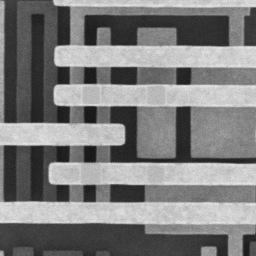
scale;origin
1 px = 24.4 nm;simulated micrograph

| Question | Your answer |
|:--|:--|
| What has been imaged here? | wiring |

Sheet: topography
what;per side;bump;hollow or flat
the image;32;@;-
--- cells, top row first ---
-------@@@@@@@@@@@@@@@@@@@@@@@@@
--------------------------------
--------------------------------
--------------------------------
--------------------------------
--------------------------------
-------@@@@@@@@@@@@@@@@@@@@@@@@@
-------@@@@@@@@@@@@@@@@@@@@@@@@@
--------------------------------
--------------------------------
--------------------------------
-------@@@@@@@@@@@@@@@@@@@@@@@@@
-------@@@@@@@@@@@@@@@@@@@@@@@@@
--------------------------------
--------------------------------
@@@@@@@@@@@@-@@-----------------
@@@@@@@@@@@@@@@@----------------
@@@@@@@@@@@@@@@@----------------
--------------------------------
--------------------------------
------@@@@@@@@@@@@@@@@@@@@@@@---
------@@@@@@@@@@@@@@@@@@@@@@@@@@
------@@@@@@@@@@@@@@@@@@@@@@@@@@
--------------------------------
--------------------------------
@@@@@@@@@@@@@@@@@@@@@@@@@@@@@@@@
@@@@@@@@@@@@@@@@@@@@@@@@@@@@@@@@
@@@@@@@@@@@@@@@@@@@@@@@@@@@@@@@@
--------------------------------
--------------------------------
--------------------------------
--------------------------------